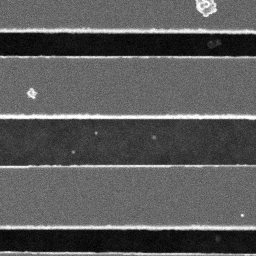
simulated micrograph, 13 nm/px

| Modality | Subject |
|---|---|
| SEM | lines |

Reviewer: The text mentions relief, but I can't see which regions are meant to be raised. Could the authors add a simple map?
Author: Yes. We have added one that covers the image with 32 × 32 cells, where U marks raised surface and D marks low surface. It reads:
UUUUUUUUUUUUUUUUUUUUUUUUUUUUUUUU
UUUUUUUUUUUUUUUUUUUUUUUUUUUUUUUU
UUUUUUUUUUUUUUUUUUUUUUUUUUUUUUUU
UUUUUUUUUUUUUUUUUUUUUUUUUUUUUUUU
DDDDDDDDDDDDDDDDDDDDDDDDDDDDDDDD
DDDDDDDDDDDDDDDDDDDDDDDDDDDDDDDD
DDDDDDDDDDDDDDDDDDDDDDDDDDDDDDDD
UUUUUUUUUUUUUUUUUUUUUUUUUUUUUUUU
UUUUUUUUUUUUUUUUUUUUUUUUUUUUUUUU
UUUUUUUUUUUUUUUUUUUUUUUUUUUUUUUU
UUUUUUUUUUUUUUUUUUUUUUUUUUUUUUUU
UUUUUUUUUUUUUUUUUUUUUUUUUUUUUUUU
UUUUUUUUUUUUUUUUUUUUUUUUUUUUUUUU
UUUUUUUUUUUUUUUUUUUUUUUUUUUUUUUU
UUUUUUUUUUUUUUUUUUUUUUUUUUUUUUUU
DDDDDDDDDDDDDDDDDDDDDDDDDDDDDDDD
DDDDDDDDDDDDDDDDDDDDDDDDDDDDDDDD
DDDDDDDDDDDDDDDDDDDDDDDDDDDDDDDD
DDDDDDDDDDDDDDDDDDDDDDDDDDDDDDDD
DDDDDDDDDDDDDDDDDDDDDDDDDDDDDDDD
DDDDDDDDDDDDDDDDDDDDDDDDDDDDDDDD
UUUUUUUUUUUUUUUUUUUUUUUUUUUUUUUU
UUUUUUUUUUUUUUUUUUUUUUUUUUUUUUUU
UUUUUUUUUUUUUUUUUUUUUUUUUUUUUUUU
UUUUUUUUUUUUUUUUUUUUUUUUUUUUUUUU
UUUUUUUUUUUUUUUUUUUUUUUUUUUUUUUU
UUUUUUUUUUUUUUUUUUUUUUUUUUUUUUUU
UUUUUUUUUUUUUUUUUUUUUUUUUUUUUUUU
UUUUUUUUUUUUUUUUUUUUUUUUUUUUUUUU
DDDDDDDDDDDDDDDDDDDDDDDDDDDDDDDD
DDDDDDDDDDDDDDDDDDDDDDDDDDDDDDDD
UUUUDDDDDDDDDDDDDDDDDDDDDDDDDDDD